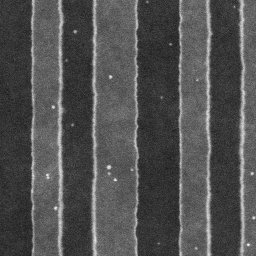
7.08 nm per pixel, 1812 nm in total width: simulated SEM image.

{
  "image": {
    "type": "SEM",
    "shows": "lines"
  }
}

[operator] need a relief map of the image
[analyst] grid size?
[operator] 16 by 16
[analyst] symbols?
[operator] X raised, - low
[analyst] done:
--XX--XXX--XX--X
--XX--XXX--XX--X
--XX--XXX--XX--X
--XX--XXX--XX--X
--XX--XXX--XX--X
--XX--XX---XX--X
--XX--XXX--XX--X
--XX--XXX--XX--X
--XX--XX---XX--X
--XX--XXX--XX--X
--XX--XXX--XX--X
--XX--XXX--XX--X
--XX--XXX--XX--X
--XX--XXX--XX--X
--XX--XX---XX--X
--XX--XXX--XX--X